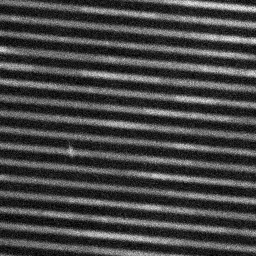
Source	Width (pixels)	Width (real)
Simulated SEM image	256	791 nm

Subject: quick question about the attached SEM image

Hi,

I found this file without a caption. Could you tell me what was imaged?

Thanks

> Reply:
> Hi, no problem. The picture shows parallel lines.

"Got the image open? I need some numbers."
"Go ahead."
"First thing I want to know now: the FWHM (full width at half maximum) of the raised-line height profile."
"14.6 nm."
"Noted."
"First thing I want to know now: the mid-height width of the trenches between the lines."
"34.9 nanometres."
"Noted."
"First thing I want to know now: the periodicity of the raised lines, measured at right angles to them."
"15.9 px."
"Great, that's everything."